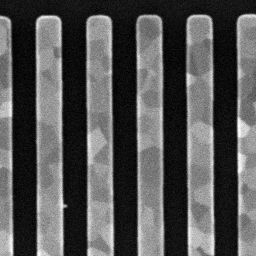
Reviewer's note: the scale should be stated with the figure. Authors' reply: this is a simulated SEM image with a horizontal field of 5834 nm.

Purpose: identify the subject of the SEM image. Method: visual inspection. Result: wiring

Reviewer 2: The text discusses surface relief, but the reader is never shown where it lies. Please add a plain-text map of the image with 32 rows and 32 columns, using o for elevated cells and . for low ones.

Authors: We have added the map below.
................................
................................
o....oo....ooo...ooo....oo....oo
o....ooo...ooo...ooo...ooo....oo
o....ooo...ooo...ooo...ooo....oo
o....ooo...ooo...ooo...ooo....oo
o....ooo...ooo...ooo...ooo....oo
o....ooo...ooo...ooo...ooo....oo
o....ooo...ooo...ooo...oooo...oo
o....ooo...ooo...ooo...oooo...oo
o....ooo...ooo...ooo...oooo...oo
o....ooo...ooo...ooo...oooo...oo
o....ooo...ooo...ooo....ooo...oo
o....ooo...ooo...ooo....oo....oo
o....ooo...ooo...ooo....oo....oo
o....ooo...ooo...ooo....oo....oo
o....ooo...ooo...ooo....ooo...oo
o....ooo...ooo...ooo....ooo...oo
o....ooo...ooo...ooo....ooo...oo
o....ooo...ooo...ooo....ooo...oo
o....ooo...ooo...ooo....ooo...oo
o....ooo...ooo...ooo....ooo...oo
o....ooo...ooo...ooo....ooo...oo
o....ooo...ooo...ooo....ooo...oo
o....ooo...ooo...ooo....ooo...oo
oo...ooo...ooo...ooo....ooo...oo
oo...ooo...ooo...ooo....ooo...oo
oo...ooo...ooo...ooo....ooo...oo
oo...ooo...ooo...ooo....ooo...oo
oo...ooo...ooo...ooo....ooo...oo
oo...ooo...ooo...ooo....ooo...oo
oo...ooo...ooo...ooo....ooo...oo